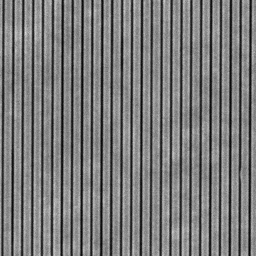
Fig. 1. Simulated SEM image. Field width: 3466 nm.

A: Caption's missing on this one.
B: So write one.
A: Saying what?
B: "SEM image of parallel lines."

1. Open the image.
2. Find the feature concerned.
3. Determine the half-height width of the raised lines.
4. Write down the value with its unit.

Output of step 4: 102 nm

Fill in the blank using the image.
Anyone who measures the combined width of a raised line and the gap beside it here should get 134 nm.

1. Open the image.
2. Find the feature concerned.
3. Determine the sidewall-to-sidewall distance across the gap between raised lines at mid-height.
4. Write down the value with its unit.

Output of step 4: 0.0389 µm